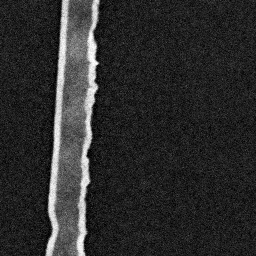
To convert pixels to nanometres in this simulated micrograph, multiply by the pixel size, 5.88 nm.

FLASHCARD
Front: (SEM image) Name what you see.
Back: one or a few lines or trenches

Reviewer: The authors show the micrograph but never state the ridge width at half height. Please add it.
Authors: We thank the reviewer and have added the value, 184 nm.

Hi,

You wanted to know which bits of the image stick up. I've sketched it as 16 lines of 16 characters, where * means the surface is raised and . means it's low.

....**..........
....**..........
....**..........
....**..........
....**..........
....**..........
....**..........
....**..........
....**..........
...**...........
...**...........
...**...........
...**...........
...**...........
...**...........
...**...........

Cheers